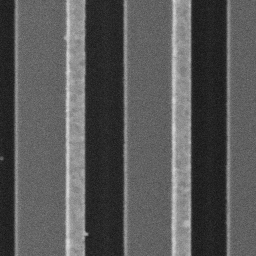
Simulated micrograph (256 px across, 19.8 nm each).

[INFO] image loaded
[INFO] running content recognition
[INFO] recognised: lines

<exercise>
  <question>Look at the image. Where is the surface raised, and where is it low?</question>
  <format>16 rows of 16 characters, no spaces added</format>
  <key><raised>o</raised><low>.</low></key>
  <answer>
.oooo...oooo..oo
.oooo...oooo..oo
.oooo...oooo..oo
.oooo...oooo..oo
.oooo...oooo..oo
.oooo...oooo..oo
.oooo...oooo..oo
.oooo...oooo..oo
.oooo...oooo..oo
.oooo...oooo..oo
.oooo...oooo..oo
.oooo...oooo..oo
.oooo...oooo..oo
.oooo...oooo..oo
.oooo...oooo..oo
.oooo...oooo..oo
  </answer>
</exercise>